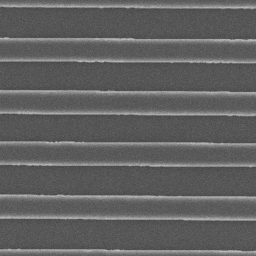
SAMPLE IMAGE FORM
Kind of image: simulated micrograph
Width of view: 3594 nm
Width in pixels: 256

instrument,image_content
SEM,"lines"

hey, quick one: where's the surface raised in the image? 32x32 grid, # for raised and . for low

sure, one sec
################################
................................
................................
................................
................................
################################
################################
################################
................................
................................
................................
##########################.##...
################################
################################
................................
................................
................................
................................
################################
################################
################################
................................
................................
................................
#####..#........................
################################
################################
................................
................................
................................
................................
################################